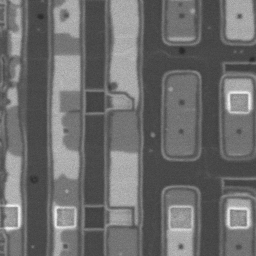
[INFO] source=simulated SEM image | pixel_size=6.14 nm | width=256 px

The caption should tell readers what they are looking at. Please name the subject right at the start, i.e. wiring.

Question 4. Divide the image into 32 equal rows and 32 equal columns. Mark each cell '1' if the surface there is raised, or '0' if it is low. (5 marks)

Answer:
01100011111001111100111110001111
01100011111001111100111110001111
01100011110001111100111110001111
11100011110001111100111110001111
11100011110001111100111110001111
11100011111001111100011100000111
11100011111001111100000000000000
11100011111001111100000000000000
11100011111001111100000000000000
11100011111001111100011110001111
11100011111001111100111110001111
11100011111001111100111110001111
11100011111000001100111110001001
11100011111000001100111110001001
11100011111001111100111110001111
11100011111001111100111110001111
11100011111001111100111110001111
11100011110001111100111110001111
11100011110001111100111110001111
11100011110001111100111110001111
11100011110001111100000000000000
11100011110001111100000000000000
11100011110001111100000000000000
11100011110001111100011100000000
11100011110001111100111110001110
11100011110001111100111110001111
00100010010000001100100010001001
00100010010000001100100010001001
00100011110001111100110010001111
01100011110001111100111110001111
01100011110001111100111110001111
01100011110001111100111110001111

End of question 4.